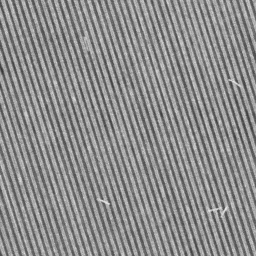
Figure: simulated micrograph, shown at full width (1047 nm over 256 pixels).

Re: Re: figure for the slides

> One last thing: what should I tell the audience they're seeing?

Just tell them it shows parallel lines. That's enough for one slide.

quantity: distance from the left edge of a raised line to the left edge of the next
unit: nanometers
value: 25.7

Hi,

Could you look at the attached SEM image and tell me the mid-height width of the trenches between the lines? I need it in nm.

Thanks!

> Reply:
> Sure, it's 13.6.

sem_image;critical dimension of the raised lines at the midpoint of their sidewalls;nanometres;10.8